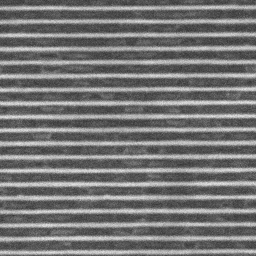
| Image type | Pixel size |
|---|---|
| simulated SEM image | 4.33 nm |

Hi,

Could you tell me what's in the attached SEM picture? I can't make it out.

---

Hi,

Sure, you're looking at parallel lines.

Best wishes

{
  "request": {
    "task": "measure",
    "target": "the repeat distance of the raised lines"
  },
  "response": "58.8 nanometers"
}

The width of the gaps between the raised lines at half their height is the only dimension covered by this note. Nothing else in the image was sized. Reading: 45.5 nanometers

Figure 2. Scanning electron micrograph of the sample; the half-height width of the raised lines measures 15.2 nanometers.